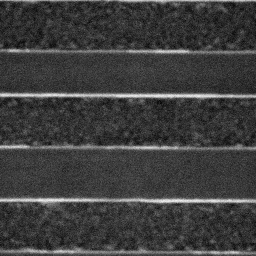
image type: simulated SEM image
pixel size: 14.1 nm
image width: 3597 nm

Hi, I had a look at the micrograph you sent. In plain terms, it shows lines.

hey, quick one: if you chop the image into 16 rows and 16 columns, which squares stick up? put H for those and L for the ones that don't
LLLLLLLLLLLLLLLL
LLLLLLLLLLLLLLLL
LLLLLLLLLLLLLLLL
HHHHHHHHHHHHHHHH
HHHHHHHHHHHHHHHH
HHHHHHHHHHHHHHHH
LLLLLLLLLLLLLLLL
LLLLLLLLLLLLLLLL
LLLLLLLLLLLLLLLL
HHHHHHHHHHHHHHHH
HHHHHHHHHHHHHHHH
HHHHHHHHHHHHHHHH
HHHHHHHHHHHHHHHH
LLLLLLLLLLLLLLLL
LLLLLLLLLLLLLLLL
LLLLLLLLLLLLLLLL